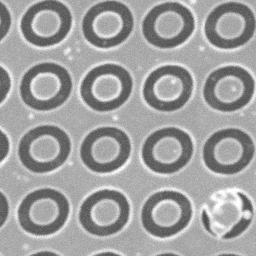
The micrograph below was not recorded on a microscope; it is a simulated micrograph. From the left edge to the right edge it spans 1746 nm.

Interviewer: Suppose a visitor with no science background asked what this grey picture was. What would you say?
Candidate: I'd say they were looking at a regular array of ring-shaped grooves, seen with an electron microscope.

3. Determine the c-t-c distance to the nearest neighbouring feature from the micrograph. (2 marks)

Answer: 417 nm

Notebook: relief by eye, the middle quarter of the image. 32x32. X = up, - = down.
XXXXXXXX------XXXXXXXXXX-----XXX
-XXXXXX---------XXXXXXX--------X
-XXXXX-----------XXXX-----------
--XXX----XXXX----XXXX---XXXX----
--XX----XXXXXX---XXX---XXXXXX---
--XX---XXXXXXX---XXX---XXXXXXX--
--XX---XXXXXXX---XXX---XXXXXXX--
--XX---XXXXXXX---XXX---XXXXXX---
-XXX----XXXXX---XXXX----XXXX----
XXXXX----------XXXXX-----------X
XXXXXX--------XXXXXXX---------XX
XXXXXXX------XXXXXXXXXX-----XXXX
XXXXXXXXXXXXXXXXXXXXXXXXXXXXXXXX
XXXXXXXXXXXXXXXXXXXXXXXXXXXXXXXX
XXXXXXXXXXXXXXXXXXXXXXXXXXXXXXXX
XXXXXXXXXXXXXXXXXXXXXXXXXXXXXXXX
XXXXXXX--------XXXXXXXX-------XX
-XXXXX----------XXXXXX---------X
-XXXX----XXX----XXXXX----XX-----
--XX----XXXXX----XXX----XXXXX---
--XX---XXXXXXX---XXX---XXXXXX---
--XX---XXXXXXX---XX----XXXXXX---
--XX---XXXXXXX---XX---XXXXXXX---
-XXX---XXXXXX---XXX----XXXXXX---
XXXXX----XX-----XXXX-----XX----X
XXXXX----------XXXXXX---------XX
XXXXXX-------XXXXXXXXX-------XXX
XXXXXXXXX-XXXXXXXXXXXXX----XXXXX
XXXXXXXXXXXXXXXXXXXXXXXXXXXXXXXX
XXXXXXXXXXXXXXXXXXXXXXXXXXXXXXXX
XXXXXXXXXXXXXXXXXXXXXXXXXXXXXXXX
XXXXXXXXX----XXXXXXXXXXXX--XXXXX